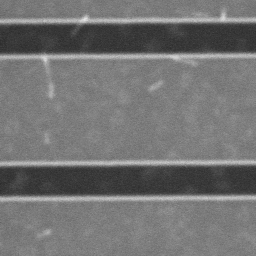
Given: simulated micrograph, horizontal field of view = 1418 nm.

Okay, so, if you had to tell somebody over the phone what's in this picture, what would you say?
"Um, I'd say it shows one or a few lines or trenches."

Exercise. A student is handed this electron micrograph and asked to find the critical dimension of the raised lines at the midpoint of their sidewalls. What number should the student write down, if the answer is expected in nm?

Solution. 203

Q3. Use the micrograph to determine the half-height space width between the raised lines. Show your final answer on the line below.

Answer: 583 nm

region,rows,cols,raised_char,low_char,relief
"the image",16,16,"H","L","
LLLLLLLLLLLLLLLL
HHHHHHHHHHHHHHHH
HHHHHHHHHHHHHHHH
HHHHHHHHHHHLHLLL
LLLLLLLLLLLLLLLL
LLLLLLLLLLLLLLLL
LLLLLLLLLLLLLLLL
LLLLLLLLLLLLLLLL
LLLLLLLLLLLLLLLL
LLLLLLLLLLLLLLLL
HHHHHHHHHHHHHHHH
HHHHHHHHHHHHHHHH
LLLLLLLLLLLLLLLL
LLLLLLLLLLLLLLLL
LLLLLLLLLLLLLLLL
LLLLLLLLLLLLLLLL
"